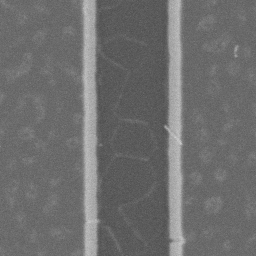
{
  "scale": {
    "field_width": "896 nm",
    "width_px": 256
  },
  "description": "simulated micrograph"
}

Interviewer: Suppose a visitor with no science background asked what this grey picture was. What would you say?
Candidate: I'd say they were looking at one or a few lines or trenches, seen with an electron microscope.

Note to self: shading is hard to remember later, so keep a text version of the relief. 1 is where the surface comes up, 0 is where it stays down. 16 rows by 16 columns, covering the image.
1111110000011111
1111110000011111
1111110000011111
1111110000011111
1111110000011111
1111110000011111
1111110000011111
1111110000011111
1111110000011111
1111110000011111
1111110000011111
1111110000011111
1111110000011111
1111110000011111
1111110000011111
1111110000011111